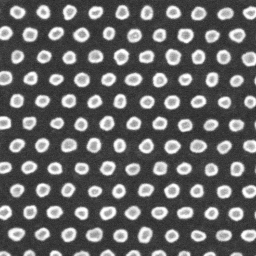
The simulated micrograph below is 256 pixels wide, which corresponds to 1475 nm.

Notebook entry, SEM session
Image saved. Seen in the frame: a regular array of raised bodies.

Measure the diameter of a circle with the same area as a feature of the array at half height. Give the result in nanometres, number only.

74.9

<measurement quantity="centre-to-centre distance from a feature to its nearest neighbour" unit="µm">0.143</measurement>